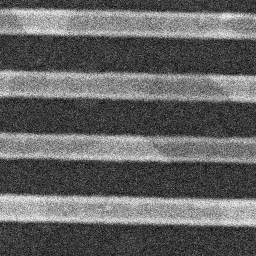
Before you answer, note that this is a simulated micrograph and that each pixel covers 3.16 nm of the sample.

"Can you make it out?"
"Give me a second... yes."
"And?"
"one or a few lines or trenches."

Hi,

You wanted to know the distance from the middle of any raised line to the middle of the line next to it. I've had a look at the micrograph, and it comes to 62.2 px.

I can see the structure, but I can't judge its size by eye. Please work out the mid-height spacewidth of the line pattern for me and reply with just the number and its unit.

133 nanometres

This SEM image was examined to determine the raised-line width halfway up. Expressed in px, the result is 20.1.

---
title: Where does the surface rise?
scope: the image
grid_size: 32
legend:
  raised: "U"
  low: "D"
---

DDDDDDDDDDDDDDDDDDDDDDDDDDDDDDDD
DDDDDDDDDDDDDDDDDDDDDDDDDDDDDDDD
UUUUUUUUUUUUUUUUUUUUUUUUUUUUUUUU
UUUUUUUUUUUUUUUUUUUUUUUUUUUUUUUU
DDDDDDDDDDDDDDDDDDDDDDDDDDDDDDDD
DDDDDDDDDDDDDDDDDDDDDDDDDDDDDDDD
DDDDDDDDDDDDDDDDDDDDDDDDDDDDDDDD
DDDDDDDDDDDDDDDDDDDDDDDDDDDDDDDD
DDDDDDDDDDDDDDDDDDDDDDDDDDDDDDDD
UUUUUUUUUUUUUUDDDDDDDDDDDDDDDDDD
UUUUUUUUUUUUUUUUUUUUUUUUUUUUUUUU
UUUUUUUUUUUUUUUUUUUUUUUUUUUUUUUU
DDDDDDDDDDDDDDDDDDDDDDDDDDDDDDDD
DDDDDDDDDDDDDDDDDDDDDDDDDDDDDDDD
DDDDDDDDDDDDDDDDDDDDDDDDDDDDDDDD
DDDDDDDDDDDDDDDDDDDDDDDDDDDDDDDD
DDDDDDDDDDDDDDDDDDDDDDDDDDDDDDDD
UUUUUUUUUUUUUUUUUUUUUUUUUDDDDUDD
UUUUUUUUUUUUUUUUUUUUUUUUUUUUUUUU
DDDDDUUUUUUUUUUUUUUUUUUUUUUUUUUU
DDDDDDDDDDDDDDDDDDDDDDDDDDDDDDDD
DDDDDDDDDDDDDDDDDDDDDDDDDDDDDDDD
DDDDDDDDDDDDDDDDDDDDDDDDDDDDDDDD
DDDDDDDDDDDDDDDDDDDDDDDDDDDDDDDD
DDDDDDDDDDDDDDDDDDDDDDDDDDDDDDDD
UUUUUUUUUUUUUUUUUUUUUUUUUUUUUUUU
UUUUUUUUUUUUUUUUUUUUUUUUUUUUUUUU
DDDDDDDDDDDDDDDUUUUUUUUUUUUUUUUU
DDDDDDDDDDDDDDDDDDDDDDDDDDDDDDDD
DDDDDDDDDDDDDDDDDDDDDDDDDDDDDDDD
DDDDDDDDDDDDDDDDDDDDDDDDDDDDDDDD
DDDDDDDDDDDDDDDDDDDDDDDDDDDDDDDD